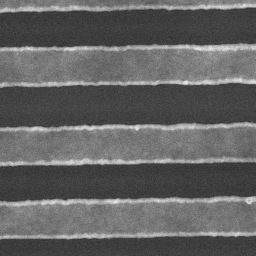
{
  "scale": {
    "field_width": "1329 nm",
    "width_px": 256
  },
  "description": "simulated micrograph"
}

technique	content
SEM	lines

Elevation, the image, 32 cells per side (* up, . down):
********************************
................................
................................
................................
................................
................................
********************************
********************************
********************************
********************************
********************..******....
................................
................................
................................
................................
.............................***
********************************
********************************
********************************
********************************
***********.....................
................................
................................
................................
................................
********************************
********************************
********************************
********************************
*************************.****..
................................
................................